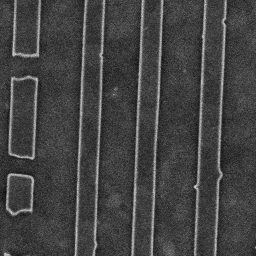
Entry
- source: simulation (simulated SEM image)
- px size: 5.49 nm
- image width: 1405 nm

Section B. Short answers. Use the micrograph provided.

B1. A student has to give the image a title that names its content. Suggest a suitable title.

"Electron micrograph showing one or a few lines or trenches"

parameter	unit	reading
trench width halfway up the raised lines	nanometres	234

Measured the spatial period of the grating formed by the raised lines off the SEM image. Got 340 nanometers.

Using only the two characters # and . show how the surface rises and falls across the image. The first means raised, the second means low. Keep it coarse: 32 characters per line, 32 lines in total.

..###......##.....##......##....
..###......##.....##......##....
..###......##.....##......##....
..###.....###.....##......##....
..###.....###.....##.....###....
..###......##.....##.....###....
..###.....###.....##.....###....
..........###.....##.....###....
..........###....###.....###....
..........###....###.....###....
.####.....###....###.....###....
.####.....###....###.....###....
.###......###....###.....###....
.###......##.....###.....###....
.###......##.....###.....###....
.###......##.....###.....###....
.###......##.....###.....###....
.###......##.....###.....##.....
.###......##.....##......##.....
..##......##.....##......##.....
..........##.....##......##.....
..........##.....##......###....
.###......##.....##......##.....
.###......##.....##......##.....
.###......##.....##......##.....
.###......##.....##......##.....
.#........##.....##......##.....
..........##.....##......##.....
..........##.....##.....###.....
..........##.....##.....###.....
.........###.....##.....###.....
.........###.....##.....###.....